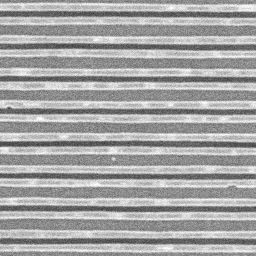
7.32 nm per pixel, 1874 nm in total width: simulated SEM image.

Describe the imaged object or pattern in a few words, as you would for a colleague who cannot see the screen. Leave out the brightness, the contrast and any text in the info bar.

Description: parallel lines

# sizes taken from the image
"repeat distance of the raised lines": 117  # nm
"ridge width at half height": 50.3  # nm